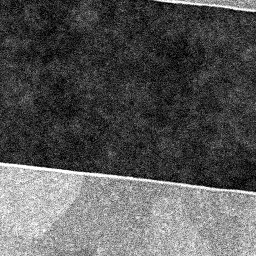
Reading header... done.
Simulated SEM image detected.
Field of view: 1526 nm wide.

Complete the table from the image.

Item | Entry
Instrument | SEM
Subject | one or a few lines or trenches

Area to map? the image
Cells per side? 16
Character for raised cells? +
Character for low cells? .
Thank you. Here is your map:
..............++
................
................
................
................
................
................
................
................
................
++..............
+++++++++++.....
++++++++++++++++
++++++++++++++++
++++++++++++++++
++++++++++++++++